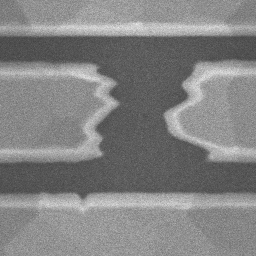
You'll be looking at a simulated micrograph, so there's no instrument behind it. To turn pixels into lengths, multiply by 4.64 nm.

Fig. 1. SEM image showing one or a few lines or trenches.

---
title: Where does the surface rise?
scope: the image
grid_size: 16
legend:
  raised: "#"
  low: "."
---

################
################
................
................
#####........###
#######.....####
#######.....####
######.....#####
######.....#####
#####.........##
................
................
#####.##########
################
################
################